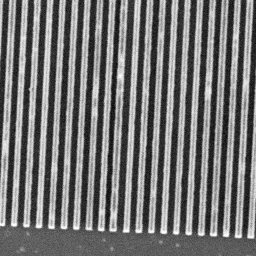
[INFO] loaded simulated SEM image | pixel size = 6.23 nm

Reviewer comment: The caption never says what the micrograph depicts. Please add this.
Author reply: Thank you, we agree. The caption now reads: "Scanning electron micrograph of parallel lines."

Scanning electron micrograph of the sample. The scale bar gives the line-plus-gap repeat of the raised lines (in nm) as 77.7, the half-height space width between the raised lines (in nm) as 48.2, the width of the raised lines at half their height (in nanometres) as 31.9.